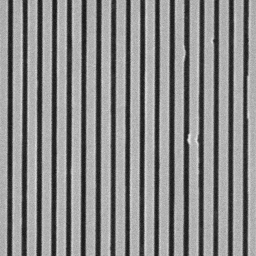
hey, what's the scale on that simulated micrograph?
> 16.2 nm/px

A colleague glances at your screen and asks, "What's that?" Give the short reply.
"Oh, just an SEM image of parallel lines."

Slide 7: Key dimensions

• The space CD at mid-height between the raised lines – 89 nanometres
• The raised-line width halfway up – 148 nm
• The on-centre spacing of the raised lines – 14.7 pixels